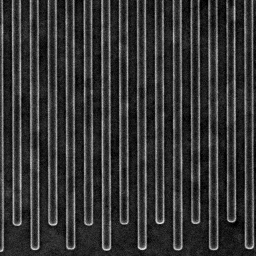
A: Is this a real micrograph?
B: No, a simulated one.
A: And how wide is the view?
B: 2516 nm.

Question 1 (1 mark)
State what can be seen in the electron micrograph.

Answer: parallel lines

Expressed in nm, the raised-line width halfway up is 81.1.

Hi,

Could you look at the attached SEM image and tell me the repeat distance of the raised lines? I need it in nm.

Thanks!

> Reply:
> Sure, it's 176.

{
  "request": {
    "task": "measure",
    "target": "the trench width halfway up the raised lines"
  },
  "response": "92.2 nm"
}